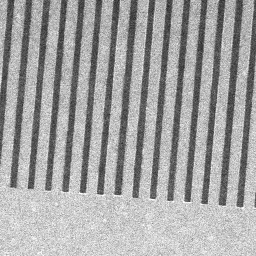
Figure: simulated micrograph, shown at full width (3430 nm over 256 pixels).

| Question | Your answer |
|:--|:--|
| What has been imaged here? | parallel lines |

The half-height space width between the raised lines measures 91.8 nm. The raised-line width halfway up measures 0.142 micrometres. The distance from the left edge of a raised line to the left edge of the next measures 0.235 micrometres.